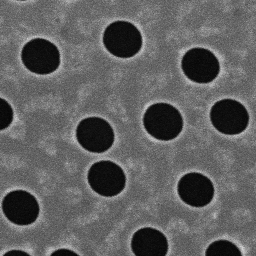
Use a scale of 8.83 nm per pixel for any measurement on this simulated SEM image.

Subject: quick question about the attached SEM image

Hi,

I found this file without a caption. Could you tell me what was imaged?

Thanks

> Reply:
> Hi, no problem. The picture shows a regular array of holes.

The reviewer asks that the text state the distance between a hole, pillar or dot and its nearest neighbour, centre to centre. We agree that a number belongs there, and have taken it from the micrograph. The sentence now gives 588 nm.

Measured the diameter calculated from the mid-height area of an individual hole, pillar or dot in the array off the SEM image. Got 332 nanometres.